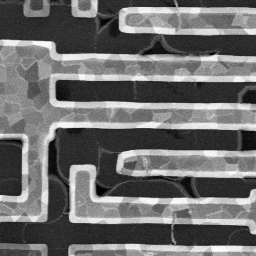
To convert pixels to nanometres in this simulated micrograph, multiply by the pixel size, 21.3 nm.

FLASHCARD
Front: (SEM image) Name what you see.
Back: wiring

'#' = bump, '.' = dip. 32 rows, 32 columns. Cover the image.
...###...###....................
...###...###....################
...............#################
................################
................................
#####...........................
#######.........................
################################
################################
################################
#######.........................
#######.........................
#######.........................
###############################.
################################
################################
######..........................
...###..........................
...###..........................
...###.........#################
...##..........#################
...###...###....################
...###...###....................
...###...##.....................
...###...###....................
######...#######################
######...#######################
.........#######################
................................
................................
................................
######...#######################